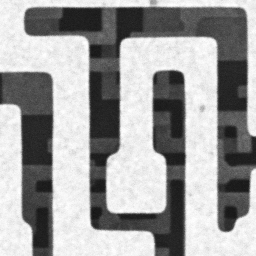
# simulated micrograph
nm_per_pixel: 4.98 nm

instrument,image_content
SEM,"wiring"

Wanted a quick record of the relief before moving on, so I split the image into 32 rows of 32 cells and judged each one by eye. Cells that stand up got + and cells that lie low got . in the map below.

++++++++++++++++++++++++++++++++
+++............................+
+++............................+
+++............................+
++++...........................+
+++++++++++....++++++++++++....+
+++++++++++....++++++++++++....+
+++++++++++....++++++++++++....+
+++++++++++....++++++++++++....+
......+++++....++++....++++....+
.......++++....++++....++++....+
.......++++....++++....++++....+
.......++++....++++....++++....+
++.....++++....++++....++++....+
+++....++++....++++....++++....+
+++....++++....++++....++++....+
+++....++++....++++....++++....+
+++....++++....++++....++++.....
+++....++++....++++....++++.....
+++....++++...++++++...++++.....
+++....++++..++++++++..++++.....
+++....++++..++++++++..++++.....
+++....++++..++++++++..++++....+
+++....++++..++++++++..++++....+
+++....++++..++++++++..++++....+
+++....++++..++++++++..++++....+
+++....++++...++++++...++++....+
+++....++++............++++...++
++++...+++++...........++++..+++
++++...++++++++++++....+++++++++
++++...++++++++++++....+++++++++
++++...++++++++++++....+++++++++